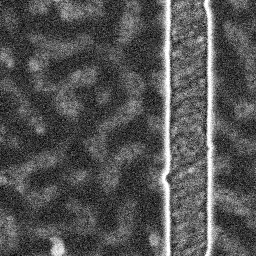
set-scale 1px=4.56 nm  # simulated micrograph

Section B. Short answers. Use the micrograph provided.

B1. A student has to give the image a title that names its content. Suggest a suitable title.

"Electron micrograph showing one or a few lines or trenches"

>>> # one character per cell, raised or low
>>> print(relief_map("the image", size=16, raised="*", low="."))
***********..***
***********..***
***********..***
***********..***
***********..***
***********..***
***********..***
***********..***
***********..***
***********..***
***********..***
**********...***
***********..***
***********..***
***********..***
***********..***